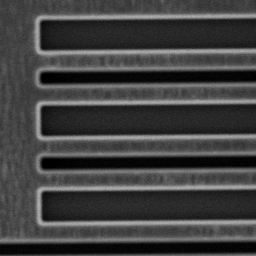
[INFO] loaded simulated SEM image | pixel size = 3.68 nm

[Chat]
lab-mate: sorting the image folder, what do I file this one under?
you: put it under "groups of lines, slits or small figures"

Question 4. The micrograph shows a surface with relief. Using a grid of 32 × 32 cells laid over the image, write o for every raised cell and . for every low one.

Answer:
oooooooooooooooooooooooooooooooo
oooooooooooooooooooooooooooooooo
ooooo...........................
ooooo...........................
ooooo...........................
ooooo...........................
ooooo.............oooooooooooooo
oooooooooooooooooooooooooooooooo
ooooooooooooooooooooooooooooooo.
ooooo...........................
ooooo........................ooo
oooooooooooooooooooooooooooooooo
oooooooooooooooooooooooooooooooo
ooooo...........................
ooooo...........................
ooooo...........................
ooooo...........................
oooooooooooooooooooooooooooooooo
oooooooooooooooooooooooooooooooo
oooooo..........................
ooooo...........................
oooooooooooooooooooooooooooooooo
oooooooooooooooooooooooooooooooo
oooooooooooooooooooooooooo......
ooooo...........................
ooooo...........................
ooooo...........................
ooooo...........................
oooooooooooooooooooooooooooooooo
oooooooooooooooooooooooooooooooo
................................
................................